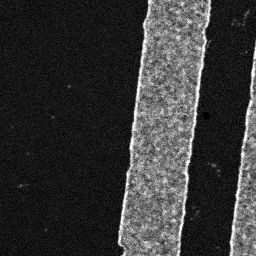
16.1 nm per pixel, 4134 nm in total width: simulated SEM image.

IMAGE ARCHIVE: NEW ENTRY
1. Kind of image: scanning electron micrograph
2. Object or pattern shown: one or a few lines or trenches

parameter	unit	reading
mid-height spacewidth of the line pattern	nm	842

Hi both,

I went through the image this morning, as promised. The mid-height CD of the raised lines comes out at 964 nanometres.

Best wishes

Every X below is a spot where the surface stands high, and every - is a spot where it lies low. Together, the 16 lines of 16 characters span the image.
---------XXXX---
---------XXXX---
---------XXXX---
---------XXXX---
---------XXXX---
---------XXX----
---------XXX----
--------XXXX---X
--------XXXX---X
--------XXXX---X
--------XXXX---X
--------XXXX---X
--------XXXX---X
--------XXX----X
--------XXX----X
--------XXX---XX